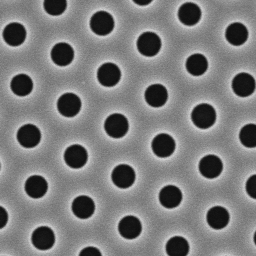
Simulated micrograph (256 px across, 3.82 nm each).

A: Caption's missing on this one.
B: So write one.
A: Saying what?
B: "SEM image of a regular array of holes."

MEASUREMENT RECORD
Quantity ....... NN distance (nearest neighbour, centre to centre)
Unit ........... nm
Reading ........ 192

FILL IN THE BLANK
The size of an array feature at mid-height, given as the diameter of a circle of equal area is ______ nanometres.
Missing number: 93.1